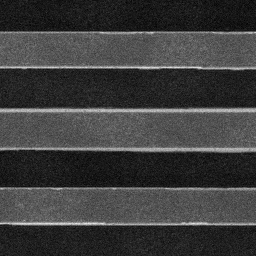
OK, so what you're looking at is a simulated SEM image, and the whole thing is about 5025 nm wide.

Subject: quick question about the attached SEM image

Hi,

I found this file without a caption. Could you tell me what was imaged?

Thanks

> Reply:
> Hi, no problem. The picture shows lines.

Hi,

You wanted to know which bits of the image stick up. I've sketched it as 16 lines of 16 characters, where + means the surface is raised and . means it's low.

................
................
++++++++++++++++
++++++++++++++++
................
................
................
++++++++++++++++
++++++++++++++++
................
................
................
++++++++++++++++
++++++++++++++++
................
................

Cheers